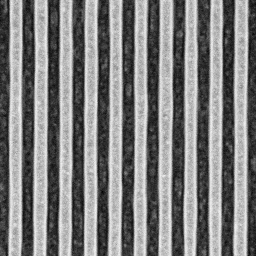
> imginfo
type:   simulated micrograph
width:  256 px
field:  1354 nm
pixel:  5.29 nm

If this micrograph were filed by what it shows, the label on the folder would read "parallel lines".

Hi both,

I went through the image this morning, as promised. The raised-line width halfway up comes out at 0.0647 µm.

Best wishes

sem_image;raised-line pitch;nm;132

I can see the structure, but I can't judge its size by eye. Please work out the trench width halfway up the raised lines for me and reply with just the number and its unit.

65.4 nm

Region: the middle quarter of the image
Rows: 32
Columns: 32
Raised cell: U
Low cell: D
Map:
UUDDDUUUDDDDUUDDDDUUUDDDUUUDDDUU
UUDDDUUUDDDUUUDDDDUUUDDDUUUDDDUU
UUDDDUUUDDDUUUDDDDUUUDDDUUUDDDUU
UUDDDUUUDDDUUUDDDDUUUDDDUUUDDDUU
UUDDDUUUDDDDUUDDDDUUUDDDUUUDDDUU
UUDDDUUUDDDDUUUDDDUUUDDDUUUDDDUU
UUDDDUUUDDDUUUUDDDUUUDDDUUUDDDUU
UUDDDUUUDDDUUUUDDDUUUDDDUUUDDDUU
UUDDDUUUDDDUUUUDDDUUUDDDUUUDDDUU
UUDDDUUUDDDDUUDDDDUUUDDDUUUDDDUU
UUDDDUUUDDDDUUDDDDUUUDDDUUUDDDUU
UUDDDUUUDDDDUUDDDDUUUDDDUUUDDDUU
UUDDDUUUDDDDUUDDDDUUUDDDUUUDDDUU
UUDDDUUUDDDDUUDDDDUUUDDDUUUDDDUU
UUDDDUUUDDDUUUDDDDUUUDDDUUUDDDUU
UUDDDUUUDDDUUUDDDDUUUDDDUUUDDDUU
UUDDDUUUDDDUUUDDDDUUUDDDUUUDDDUU
UUDDDUUUDDDUUUDDDDUUUDDDUUUDDDUU
UUDDDUUUDDDUUUDDDDUUUDDDUUUDDDUU
UUDDDUUUDDDUUUDDDDUUUDDDUUUDDDUU
UUDDDUUUDDDUUUDDDDUUDDDDUUUDDDUU
UUDDDUUUDDDUUUDDDDUUDDDDUUUDDDUU
UUDDDUUUDDDUUUDDDDUUDDDDUUUDDDUU
UUDDDUUUDDDUUUDDDDUUDDDDUUUDDDUU
UUDDDUUUDDDUUUDDDDUUUDDDUUUDDDUU
UUDDDUUUDDDUUUDDDDUUDDDDUUUDDDUU
UUDDDUUUDDDUUUDDDDUUDDDDUUUDDDUU
UUDDDUUUDDDUUUDDDDUUDDDDUUUDDDUU
UUDDDUUUDDDUUUDDDDUUDDDDUUUDDDUU
UUDDDUUUDDDUUUDDDDUUDDDDUUUDDDUU
UUDDDUUUDDDUUUDDDDUUDDDDUUUDDDUU
UUDDDUUUDDDUUUDDDDUUDDDDUUUDDDUU